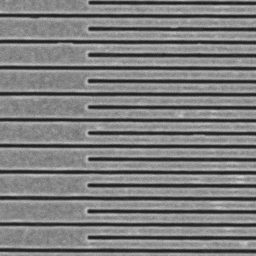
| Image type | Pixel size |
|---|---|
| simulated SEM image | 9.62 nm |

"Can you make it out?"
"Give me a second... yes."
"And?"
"parallel lines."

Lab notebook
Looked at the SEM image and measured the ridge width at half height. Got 86.6 nm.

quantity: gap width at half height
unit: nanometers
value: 36.1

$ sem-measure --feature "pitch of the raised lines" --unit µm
0.125